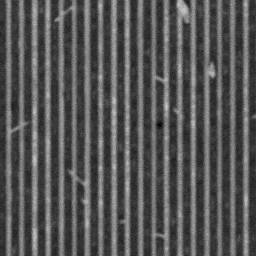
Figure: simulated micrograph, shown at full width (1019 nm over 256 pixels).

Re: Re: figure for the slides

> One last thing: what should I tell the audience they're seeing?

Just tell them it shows parallel lines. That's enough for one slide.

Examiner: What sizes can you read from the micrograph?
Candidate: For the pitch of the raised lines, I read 52.6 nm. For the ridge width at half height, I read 14.4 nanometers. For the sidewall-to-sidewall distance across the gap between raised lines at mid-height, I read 35.9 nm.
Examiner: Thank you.